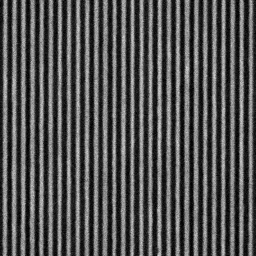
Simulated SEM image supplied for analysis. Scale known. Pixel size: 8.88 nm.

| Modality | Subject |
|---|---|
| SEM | parallel lines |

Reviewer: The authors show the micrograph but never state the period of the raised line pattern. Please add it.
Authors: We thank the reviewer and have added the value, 80.7 nanometres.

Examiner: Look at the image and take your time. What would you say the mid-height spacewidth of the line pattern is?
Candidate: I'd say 45.5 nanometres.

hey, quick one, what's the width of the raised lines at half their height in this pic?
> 31.1 nm